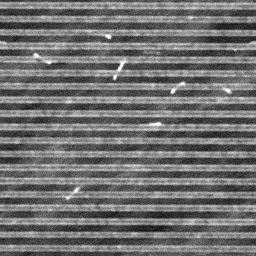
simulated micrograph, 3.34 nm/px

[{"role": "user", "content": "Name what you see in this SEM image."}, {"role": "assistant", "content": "parallel lines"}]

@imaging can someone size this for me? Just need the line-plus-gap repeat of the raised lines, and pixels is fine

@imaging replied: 13.5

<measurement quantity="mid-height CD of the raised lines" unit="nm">18.4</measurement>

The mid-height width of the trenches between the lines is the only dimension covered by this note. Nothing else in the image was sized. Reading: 27.1 nm